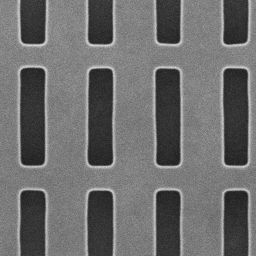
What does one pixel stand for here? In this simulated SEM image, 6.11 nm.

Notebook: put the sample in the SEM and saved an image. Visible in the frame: groups of lines, slits or small figures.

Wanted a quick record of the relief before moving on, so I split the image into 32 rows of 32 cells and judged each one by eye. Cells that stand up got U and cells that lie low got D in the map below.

UUDDDDUUUUUDDDUUUUUDDDDUUUUUDDDU
UUDDDDUUUUUDDDUUUUUDDDDUUUUUDDDU
UUDDDDUUUUUDDDUUUUUUDDDUUUUUDDDU
UUDDDDUUUUUDDDUUUUUUDDDUUUUUDDDU
UUDDDDUUUUUDDDUUUUUUDDDUUUUUDDDU
UUUUDUUUUUUUDUUUUUUUUDUUUUUUDDUU
UUUUUUUUUUUUUUUUUUUUUUUUUUUUUUUU
UUUUUUUUUUUUUUUUUUUUUUUUUUUUUUUU
UUUDDUUUUUUUDUUUUUUUDDUUUUUUUDUU
UUDDDDUUUUUDDDUUUUUDDDDUUUUUDDDU
UUDDDDUUUUUDDDUUUUUDDDDUUUUUDDDU
UUDDDDUUUUUDDDUUUUUDDDDUUUUUDDDU
UUDDDDUUUUUDDDUUUUUDDDDUUUUUDDDU
UUDDDDUUUUUDDDUUUUUDDDDUUUUUDDDU
UUDDDDUUUUUDDDUUUUUDDDDUUUUUDDDU
UUDDDDUUUUUDDDUUUUUDDDDUUUUUDDDU
UUDDDDUUUUUDDDUUUUUDDDDUUUUUDDDU
UUDDDDUUUUUDDDUUUUUUDDDUUUUUDDDU
UUDDDDUUUUUDDDUUUUUUDDDUUUUUDDDU
UUDDDDUUUUUDDDUUUUUDDDDUUUUUDDDU
UUUDDUUUUUUDDDUUUUUUDDUUUUUUDDDU
UUUUUUUUUUUUUUUUUUUUUUUUUUUUUUUU
UUUUUUUUUUUUUUUUUUUUUUUUUUUUUUUU
UUUUUUUUUUUUUUUUUUUUUUUUUUUUUUUU
UUUDDDUUUUUDDDUUUUUUDDDUUUUUDDDU
UUDDDDUUUUUDDDUUUUUDDDDUUUUUDDDU
UUDDDDUUUUUDDDUUUUUDDDDUUUUUDDDU
UUDDDDUUUUUDDDUUUUUDDDDUUUUUDDDU
UUDDDDUUUUUDDDUUUUUDDDDUUUUUDDDU
UUDDDDUUUUUDDDUUUUUDDDDUUUUUDDDU
UUDDDDUUUUUDDDUUUUUDDDDUUUUUDDDU
UUDDDDUUUUUDDDUUUUUDDDDUUUUUDDDU